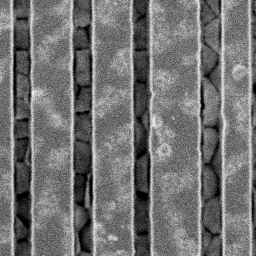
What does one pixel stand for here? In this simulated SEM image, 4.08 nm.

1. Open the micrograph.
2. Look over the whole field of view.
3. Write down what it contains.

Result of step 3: one or a few lines or trenches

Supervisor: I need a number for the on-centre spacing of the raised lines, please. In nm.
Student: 251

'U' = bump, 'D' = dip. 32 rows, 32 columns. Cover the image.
UDDDUUUUUDDDUUUUDDDUUUUUUDDDUUUD
UDDDUUUUUDDDUUUUDDDUUUUUUDDDUUUD
UUDDUUUUUDDDUUUUDDDUUUUUUDDDUUUD
UUDDUUUUUDDDUUUUDDDUUUUUUDDDUUUD
UUDDUUUUUDDDUUUUDDDUUUUUUDDDUUUD
UUDDUUUUUDDDUUUUUDDUUUUUUDDDUUUD
UUDDUUUUUDDDUUUUUDDUUUUUUDDDUUUD
UUDDUUUUUDDDUUUUUDDUUUUUUDDDUUUD
UUDDUUUUUDDDUUUUUDDUUUUUUDDDUUUD
UUDDUUUUUDDDUUUUUDDUUUUUUDDDUUUD
UUDDUUUUUDDDUUUUUDDUUUUUUDDDUUUD
UUDDUUUUUDDDUUUUUDDUUUUUUDDDUUUD
UUDDUUUUUDDDUUUUUDDUUUUUUDDDUUUD
UUDDUUUUUDDDUUUUUDDUUUUUUDDDUUUD
UUDDUUUUUDDDUUUUUDDUUUUUUDDDUUUD
UUDDUUUUUDDDUUUUUDDUUUUUUDDDUUUD
UUDDUUUUUDDDUUUUUDDUUUUUUDDDUUUD
UUDDUUUUUDDDUUUUUDDUUUUUUDDDUUUD
UUDDUUUUUDDDUUUUUDDUUUUUUDDDUUUD
UUDDUUUUUDDDUUUUUDDUUUUUUDDDUUUD
UUDDUUUUUDDDUUUUUDDUUUUUUDDDUUUD
UUDDUUUUUDDDUUUUUDDUUUUUUDDDUUUD
UUDDUUUUUDDDUUUUUDDUUUUUUDDDUUUD
UUDDUUUUUDDDUUUUUDDUUUUUUDDDUUUD
UUDDUUUUUDDDUUUUUDDUUUUUUDDDUUUD
UUDDUUUUUDDDUUUUUDDUUUUUUDDDUUUD
UUDDUUUUUDDDUUUUUDDUUUUUUDDDUUUD
UUDDUUUUUDDDUUUUUDDUUUUUUDDDUUUD
UUDDUUUUUDDDUUUUUDDUUUUUUDDDUUUD
UUDDUUUUUDDDUUUUUDDUUUUUUDDDUUUD
UUDDUUUUUDDDUUUUUDDUUUUUUDDDUUUD
UUDDUUUUUDDDUUUUUDDUUUUUUDDDUUUD